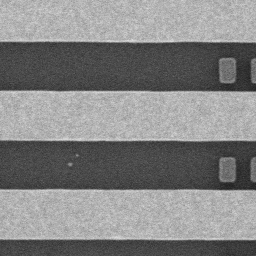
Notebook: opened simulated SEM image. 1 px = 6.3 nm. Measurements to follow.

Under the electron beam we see wiring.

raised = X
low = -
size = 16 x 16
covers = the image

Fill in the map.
XXXXXXXXXXXXXXXX
XXXXXXXXXXXXXXXX
XXXXXXXXXXXXXXXX
----------------
--------------X-
----------------
XXXXXXXXXXXXXXXX
XXXXXXXXXXXXXXXX
XXXXXXXXXXXXXXXX
----------------
--------------X-
----------------
XXXXXXXXXXXXXXXX
XXXXXXXXXXXXXXXX
XXXXXXXXXXXXXXXX
----------------